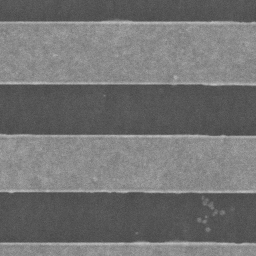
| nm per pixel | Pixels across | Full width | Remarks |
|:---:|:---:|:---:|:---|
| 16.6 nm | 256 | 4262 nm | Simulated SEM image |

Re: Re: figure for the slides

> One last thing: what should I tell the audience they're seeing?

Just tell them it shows lines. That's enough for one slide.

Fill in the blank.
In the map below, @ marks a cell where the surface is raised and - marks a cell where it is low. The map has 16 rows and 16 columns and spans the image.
----------------
@@@@@@@@@@@@@@@@
@@@@@@@@@@@@@@@@
@@@@@@@@@@@@@@@@
@@@@@@@@@@@@@@@@
----------------
----------------
----------------
@@@@@@@@@@@@@---
@@@@@@@@@@@@@@@@
@@@@@@@@@@@@@@@@
@@@@@@@@@@@@@@@@
----------------
----------------
----------------
@@@@@@@@@@@@@@@@